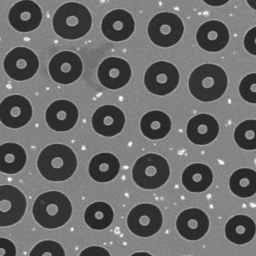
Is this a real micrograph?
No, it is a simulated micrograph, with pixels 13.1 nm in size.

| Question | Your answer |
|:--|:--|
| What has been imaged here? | a regular array of ring-shaped grooves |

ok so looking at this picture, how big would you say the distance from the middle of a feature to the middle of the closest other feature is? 612 nm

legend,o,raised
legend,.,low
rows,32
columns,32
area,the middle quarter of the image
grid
oo...oooo.......ooooo.......oooo
oo...ooo....o....oooo........ooo
....oooo...ooo...ooo.........ooo
....oooo.........ooo...ooo...oo.
...oooooo.......oooo....o....oo.
oooooooooo.....ooooo........ooo.
ooooooooooooooooooooo.......ooo.
oooooooooooooooooooooo....oooooo
oooooooooooooooooooooooooooooooo
..oooooooooooooooooooooooooooooo
...oooooo....ooooooooooooooooooo
....oooo......oooooooooooooooooo
....ooo........ooooo......oooooo
....ooo...oo...oooo.......oooooo
...oooo...oo...oooo...oo...oooo.
..ooooo........oooo...oo...oooo.
.ooooooo.......oooo........oooo.
ooooooooo....ooooooo......ooooo.
ooooooooooooooooooooo....oooooo.
oooooooooooooooooooooooooooooooo
.ooooooooooooooooooooooooooooooo
..oooooooooooooooooooooooooooooo
...ooooo....ooooooooo..ooooooooo
...oooo......oooooo......ooooooo
...oooo.......oooo........oooooo
...ooo...oo...ooo.........ooooo.
...ooo...oo...ooo....oo...oooo..
..oooo.......oooo....oo...oooo..
.oooooo......oooo.........ooo...
oooooooo...ooooooo.......ooooo..
ooooooooooooooooooo.....oooooo..
ooooooooooooooooooooooooooooooo.